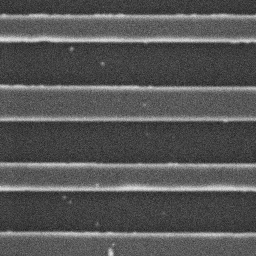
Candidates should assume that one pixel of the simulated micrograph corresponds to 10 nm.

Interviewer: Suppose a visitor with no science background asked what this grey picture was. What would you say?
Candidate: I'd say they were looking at lines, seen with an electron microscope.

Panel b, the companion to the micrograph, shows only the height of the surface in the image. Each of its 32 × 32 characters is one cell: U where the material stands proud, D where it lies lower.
DDDDDDDDDDDDDDDDDDDDDDDDDDDDDDDD
DDDDDDDDDDDDDDDDDDDDDDDDDDDDDDDD
UUUUUUUUUUUUUUUUUUUUUUUUUUUUUUUU
UUUUUUUUUUUUUUUUUUUUUUUUUUUUUUUU
UUUUUUUUUUUUUUUUUUUUUUUUUUUUUUUU
DDDDDDDDDDDDDDDDDDDDDDDDDDDDDDDD
DDDDDDDDDDDDDDDDDDDDDDDDDDDDDDDD
DDDDDDDDDDDDDDDDDDDDDDDDDDDDDDDD
DDDDDDDDDDDDDDDDDDDDDDDDDDDDDDDD
DDDDDDDDDDDDDDDDDDDDDDDDDDDDDDDD
DDDDDDDDDDDDDDDDDDDDDDDDDDDDDDDD
UUUUUUUUUUUUUUUUUUUUUUUUUUUUUUUU
UUUUUUUUUUUUUUUUUUUUUUUUUUUUUUUU
UUUUUUUUUUUUUUUUUUUUUUUUUUUUUUUU
UUUUUUUUUUUUUUUUUUUUUUUUUUUUUUUU
DDDDDDDDDDDDDDDDDDDDDDDDDDDDDDDD
DDDDDDDDDDDDDDDDDDDDDDDDDDDDDDDD
DDDDDDDDDDDDDDDDDDDDDDDDDDDDDDDD
DDDDDDDDDDDDDDDDDDDDDDDDDDDDDDDD
DDDDDDDDDDDDDDDDDDDDDDDDDDDDDDDD
UUUUUUUUUUUUDDDDDDDDDUUDDDDDDDDD
UUUUUUUUUUUUUUUUUUUUUUUUUUUUUUUU
UUUUUUUUUUUUUUUUUUUUUUUUUUUUUUUU
UUUUUUUUUUUUUUUUUUUUUUUUUUUUUUUU
DDDDDDDDDDDDDDDDDDDDDDDDDDDDDDDD
DDDDDDDDDDDDDDDDDDDDDDDDDDDDDDDD
DDDDDDDDDDDDDDDDDDDDDDDDDDDDDDDD
DDDDDDDDDDDDDDDDDDDDDDDDDDDDDDDD
DDDDDDDDDDDDDDDDDDDDDDDDDDDDDDDD
UUUUUUUUUUUUUUUUUUUUUUUUUUUUUUUU
UUUUUUUUUUUUUUUUUUUUUUUUUUUUUUUU
UUUUUUUUUUUUUUUUUUUUUUUUUUUUUUUU